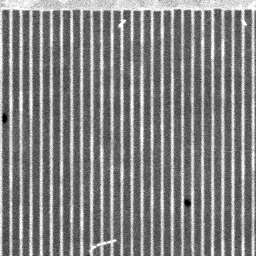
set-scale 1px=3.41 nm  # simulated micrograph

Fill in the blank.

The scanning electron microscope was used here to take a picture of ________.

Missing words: parallel lines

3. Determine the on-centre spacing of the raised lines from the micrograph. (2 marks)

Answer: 34.4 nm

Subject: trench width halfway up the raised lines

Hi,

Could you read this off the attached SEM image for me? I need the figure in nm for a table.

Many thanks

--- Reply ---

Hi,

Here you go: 27.3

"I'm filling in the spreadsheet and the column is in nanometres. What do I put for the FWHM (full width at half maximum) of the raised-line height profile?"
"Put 6.8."